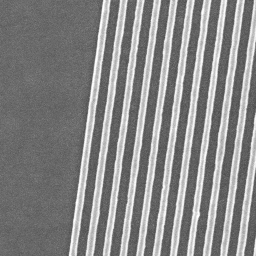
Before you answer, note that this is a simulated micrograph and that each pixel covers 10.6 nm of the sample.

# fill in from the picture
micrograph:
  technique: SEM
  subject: parallel lines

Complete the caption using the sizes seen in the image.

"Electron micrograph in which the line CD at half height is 64.1 nanometers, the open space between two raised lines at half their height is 110 nm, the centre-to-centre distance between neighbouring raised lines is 175 nanometres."